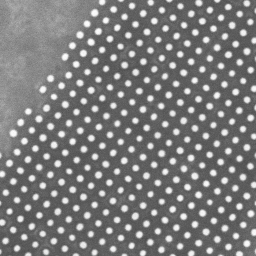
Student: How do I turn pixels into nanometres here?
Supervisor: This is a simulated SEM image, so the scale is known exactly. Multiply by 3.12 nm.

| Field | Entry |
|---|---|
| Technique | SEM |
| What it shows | a regular array of raised bodies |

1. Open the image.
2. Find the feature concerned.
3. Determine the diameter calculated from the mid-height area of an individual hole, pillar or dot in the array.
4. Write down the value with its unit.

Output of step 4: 5.96 pixels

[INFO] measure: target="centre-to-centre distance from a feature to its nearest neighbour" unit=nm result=40.7